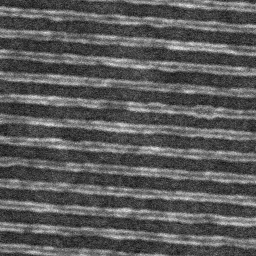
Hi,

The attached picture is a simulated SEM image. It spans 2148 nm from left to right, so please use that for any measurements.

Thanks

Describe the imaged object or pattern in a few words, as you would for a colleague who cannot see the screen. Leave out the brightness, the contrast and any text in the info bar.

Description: parallel lines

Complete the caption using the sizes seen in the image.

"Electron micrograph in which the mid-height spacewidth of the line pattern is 15 pixels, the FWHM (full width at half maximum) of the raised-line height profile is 56.5 nanometres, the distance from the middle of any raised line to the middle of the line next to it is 180 nm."